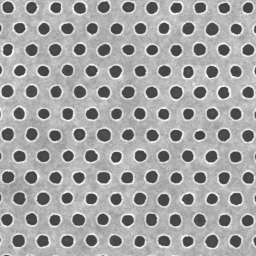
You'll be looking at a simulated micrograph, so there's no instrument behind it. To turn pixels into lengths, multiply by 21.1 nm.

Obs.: a regular array of holes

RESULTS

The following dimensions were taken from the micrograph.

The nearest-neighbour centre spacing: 0.501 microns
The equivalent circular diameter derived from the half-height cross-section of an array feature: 255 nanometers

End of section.